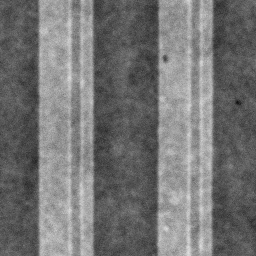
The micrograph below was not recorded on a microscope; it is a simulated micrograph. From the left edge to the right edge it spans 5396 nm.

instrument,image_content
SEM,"lines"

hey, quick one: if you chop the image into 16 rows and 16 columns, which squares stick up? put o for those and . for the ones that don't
...ooo....ooo...
...ooo....ooo...
...ooo....ooo...
...ooo....ooo...
...ooo....ooo...
...ooo....ooo...
...ooo....ooo...
...ooo....ooo...
...ooo....ooo...
...ooo....ooo...
...ooo....ooo...
...ooo....ooo...
...ooo....ooo...
...ooo....ooo...
...ooo....ooo...
...ooo....ooo...